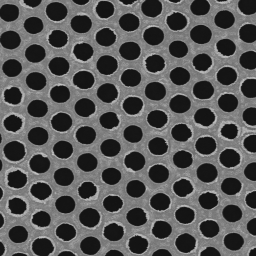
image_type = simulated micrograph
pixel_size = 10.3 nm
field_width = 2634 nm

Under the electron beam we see a regular array of holes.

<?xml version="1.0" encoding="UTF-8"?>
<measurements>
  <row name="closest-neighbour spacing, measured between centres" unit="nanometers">278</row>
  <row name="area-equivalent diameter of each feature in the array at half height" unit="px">18.7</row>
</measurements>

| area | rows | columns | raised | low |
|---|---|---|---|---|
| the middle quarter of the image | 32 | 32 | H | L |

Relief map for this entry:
LHHHHHHHLLLLLHHHHHHHLLLLLHHHHHHH
LHHHHHHHLLLLLHHLLLHHHLLLHHHLLLLH
HHHLLLLHHHLLHHHLLLLHHHHHHHHLLLLH
HHLLLLLHHHHHHHLLLLLHHHHHHHHLLLLH
HHLLLLLLHHHHHHLLLLLHHHHHHHHLLLLH
HHHLLLLHHLLLLHHHLLHHHLLLLHHHHHHH
LHHHHHHHLLLLLHHHHHHHLLLLLHHHHHHH
LHHHHHHHLLLLLHHHHHHHLLLLLHHHHHHH
LHHHHHHHHLLLLHHHLLLHHLLLLHHLLLLH
HHHLLLLHHHLLHHHLLLLLHHHHHHHLLLLL
HHHLLLLLHHHHHHHLLLLLHHHHHHLLLLLL
HHHLLLLLHHHHHHHLLLLHHHHHHHHLLLLH
LHHLLLLHHHLLLHHHLLHHHLLLLHHHHHHH
LLHHHHHHHLLLLHHHHHHHHLLLLLHHHHHH
LLHHHHHHHLLLLLHHHHHHHLLLLLHHHHHH
LLHHHHHHHHLLLHHHLLHHHHLLLHHHLLLH
LHHLLLLHHHHHHHHLLLLHHHHHHHHLLLLL
HHHLLLLLHHHHHHHLLLLLHHHHHHHLLLLL
HHHLLLLLHHHHHHHLLLLHHHHLHHHLLLLH
LHHHLLLHHHLLLHHHHLHHHLLLLHHHHHHH
LLHHHHHHHLLLLLHHHHHHHLLLLLHHHHHH
LLHHHHHHHLLLLLHHHHHHHLLLLLHHHHHH
LLHHHLLHHHLLLHHHLLLHHHLLLHHHLLLL
LHHHLLLLHHHHHHHLLLLLHHHHHHHLLLLL
HHHLLLLLHHHHHHHLLLLLHHHHHHHLLLLL
HHHHLLLLHHHHHHHLLLLLHHLLLHHHLLLH
LLHHHLLHHHLLLHHHHLLHHLLLLLHHHHHH
LLHHHHHHHHLLLLHHHHHHHLLLLLHHHHHH
LLHHHHHHHHLLLLHHHHHHHHLLLLHHHHHH
LLHHHLHHHHLLLHHHLLLHHHHLLHHHLLLH
HHHHLLLLHHHHHHHHLLLLHHHHHHHLLLLL
HHHHLLLLHHHHHHHHLLLLHHHHHHHLLLLL